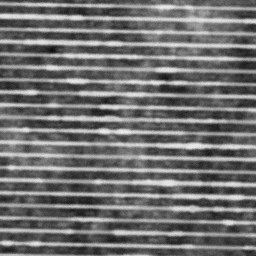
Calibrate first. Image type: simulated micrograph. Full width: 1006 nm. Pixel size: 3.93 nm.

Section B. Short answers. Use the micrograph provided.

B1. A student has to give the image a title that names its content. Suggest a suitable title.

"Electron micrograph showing parallel lines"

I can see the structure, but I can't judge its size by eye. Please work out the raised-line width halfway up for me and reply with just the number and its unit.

0.0108 microns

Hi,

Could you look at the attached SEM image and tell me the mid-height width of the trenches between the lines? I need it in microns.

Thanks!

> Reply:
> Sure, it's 0.0368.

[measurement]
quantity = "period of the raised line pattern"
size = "49.5 nm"